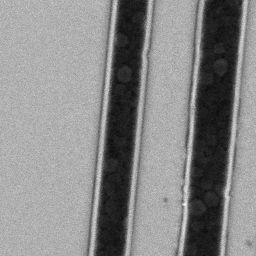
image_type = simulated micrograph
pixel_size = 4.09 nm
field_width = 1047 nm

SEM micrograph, one or a few lines or trenches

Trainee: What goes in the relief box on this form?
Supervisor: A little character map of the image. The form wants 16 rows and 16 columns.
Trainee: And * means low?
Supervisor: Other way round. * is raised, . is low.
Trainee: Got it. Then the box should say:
.......**....**.
.......**...***.
.......**...***.
.......**...***.
.......**...***.
.......**...***.
.......**...***.
......***...***.
......***...***.
......***...***.
......**....**..
......**....**..
......**....**..
......**....**..
......**...***..
......**...***..